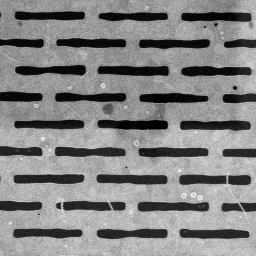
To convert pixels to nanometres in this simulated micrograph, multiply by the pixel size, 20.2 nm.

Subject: groups of lines, slits or small figures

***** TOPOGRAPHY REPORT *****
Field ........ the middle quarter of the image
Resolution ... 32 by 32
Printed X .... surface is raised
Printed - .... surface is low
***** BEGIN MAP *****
-----XXXX---------X-------XXXXXX
------XX------------------XXX---
-----XXXX-----------------XXX---
XXXXXXXXXXXXXXXXXXXXXXXXXXXXXXXX
XXXXXXXXXXXXXXXXXXXXXXXXXXXXXXXX
XXXXXXXXXXXXXXXXXXXXXXXXXXXXXXXX
XXXXXXXXXXXXXXXXXXXXXXXXXXXXXXXX
---------------XXXX-------------
----------------XXX-------------
---XXXX--------XXXX-------------
XXXXXXXXXXXXXXXXXXXXXXXXXXXXXXXX
XXXXXXXXXXXXXXXXXXXXXXXXXXXXXXXX
XXXXXXXXXXXXXXXXXXXXXXXXXXXXXXXX
XXXXXXXXXXXXXXXXXXXXXXXXXXXXXXXX
-----XXX------------------XXX---
-----XXX------------------XXX---
--XXXXXXXXXXXX-----------XXXX---
XXXXXXXXXXXXXXXXXXXXXXXXXXXXXXXX
XXXXXXXXXXXXXXXXXXXXXXXXXXXXXXXX
XXXXXXXXXXXXXXXXXXXXXXXXXXXXXXXX
XXXXXXXXXXXXXXXXXXXXXXXXXXXXXXXX
---------------XXXX-------------
----------------XXX-------------
XXXXXXXXXXXXXXXXXXXXXXXXXXXXXXXX
XXXXXXXXXXXXXXXXXXXXXXXXXXXXXXXX
XXXXXXXXXXXXXXXXXXXXXXXXXXXXXXXX
XXXXXXXXXXXXXXXXXXXXXXXXXXXXXXXX
----XXXXX--XXXXXXXXXXXXXXXXXXXXX
-----XXX------------------XXX---
-----XXX------------------XXX---
XXXXXXXXXXXXXXXXXXXXXXXXXXXXXXXX
XXXXXXXXXXXXXXXXXXXXXXXXXXXXXXXX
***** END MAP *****